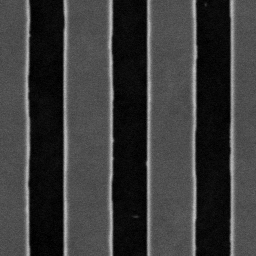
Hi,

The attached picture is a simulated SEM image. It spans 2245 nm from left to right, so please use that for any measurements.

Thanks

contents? lines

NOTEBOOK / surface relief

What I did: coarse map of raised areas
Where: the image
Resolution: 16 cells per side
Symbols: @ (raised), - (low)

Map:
@@--@@@--@@@--@@
@@--@@@--@@@--@@
@@--@@@--@@@--@@
@@--@@@--@@@--@@
@@--@@@--@@@--@@
@@--@@@--@@@--@@
@@--@@@--@@@--@@
@@--@@@--@@@--@@
@@--@@@--@@@--@@
@@--@@@--@@@--@@
@@--@@@--@@@--@@
@@--@@@--@@@--@@
@@--@@@--@@@--@@
@@--@@@--@@@--@@
@@--@@@--@@@--@@
@@--@@@--@@@--@@